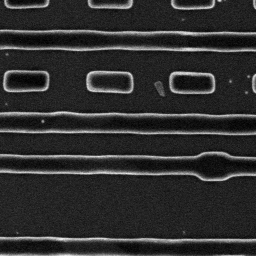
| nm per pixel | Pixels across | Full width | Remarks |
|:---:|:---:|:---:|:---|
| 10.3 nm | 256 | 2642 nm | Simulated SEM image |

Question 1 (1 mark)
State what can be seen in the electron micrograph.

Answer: wiring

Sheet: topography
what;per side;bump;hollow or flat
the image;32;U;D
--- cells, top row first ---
DUUUUUDDDDDUUUUUDDDDDUUUUUUDDDDD
DDDDDDDDDDDDDDDDDDDDDDDDDDDDDDDD
DDDDDDDDDDDDDDDDDDDDDDDDDDDDDDDD
DDDDDDDDDDDDDDDDDDDDDDDDDDDDDDDD
UUUUUUUUUUUUUUUUUUUUUUUDUUUUUUUU
UUUUUUUUUUUUUUUUUUUUUUUDUUUUUUUU
DDDDDDDDDDDDDDDDDDDDDDDDDDDDDDDD
DDDDDDDDDDDDDDDDDDDDDDDDDDDDDDDD
DDDDDDDDDDDDDDDDDDDDDDDDDDDDDDDD
DUUUUUDDDDDUUUUUDDDDDUUUUUUDDDDD
UUUUUUDDDDDUUUUUUDDDDUUUUUUDDDDD
DDDDDDDDDDDDDDUUDDDDDDUUUUDDDDDD
DDDDDDDDDDDDDDDDDDDDDDDDDDDDDDDD
DDDDDDDDDDDDDDDDDDDDDDDDDDDDDDDD
UUUUUUUUUUUUUUUUUUUUUUUUUUUUUUUU
UUUUUUUUUUUUUUUUUUUUUUUUUUUUUUUU
DDUUUUDUUUUUUUUUUUUUUUUUUUUUUUUU
DDDDDDDDDDDDDDDDDDDDDDDDDDDDDDDD
DDDDDDDDDDDDDDDDDDDDDDDDDDDDDDDD
UUUUUUUUUUUDUUUUUUUDDDDDUUUUUDDD
UUUUUUUUUUUUUUUUUUUUUUUUUUUUUUUU
DUUUUUUUUUUUUUUUUUUUUUUUUUUUUUUU
DDDDDDDDDDDDDDDDDDDDDDDDDUUUDDDD
DDDDDDDDDDDDDDDDDDDDDDDDDDDDDDDD
DDDDDDDDDDDDDDDDDDDDDDDDDDDDDDDD
DDDDDDDDDDDDDDDDDDDDDDDDDDDDDDDD
DDDDDDDDDDDDDDDDDDDDDDDDDDDDDDDD
DDDDDDDDDDDDDDDDDDDDDDDDDDDDDDDD
DDDDDDDDDDDDDDDDDDDDDDDDDDDDDDDD
DDDDDDDDDDDDDDDDDDDDDDDDDDDDDDDD
UUUUUUUUUUUUUUUUUUUUUUUUUUUUUUUU
UUUUUUUUUUUUUUUUUUUUUUUUUUUUDDUU